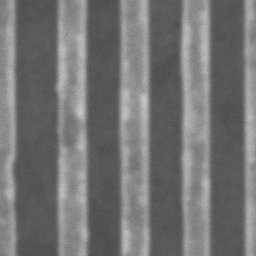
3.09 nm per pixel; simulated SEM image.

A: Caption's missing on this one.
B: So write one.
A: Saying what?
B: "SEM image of one or a few lines or trenches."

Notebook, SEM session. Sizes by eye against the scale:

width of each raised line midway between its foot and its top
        71.9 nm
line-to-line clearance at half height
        123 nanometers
